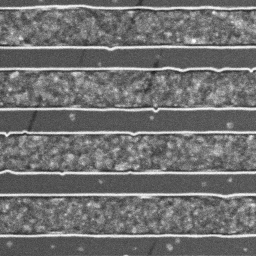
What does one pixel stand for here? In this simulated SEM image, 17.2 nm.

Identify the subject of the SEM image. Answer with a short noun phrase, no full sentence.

one or a few lines or trenches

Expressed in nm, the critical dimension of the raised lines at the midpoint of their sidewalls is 381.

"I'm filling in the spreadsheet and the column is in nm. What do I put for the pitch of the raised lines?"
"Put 1080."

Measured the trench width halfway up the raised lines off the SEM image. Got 39.9 pixels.